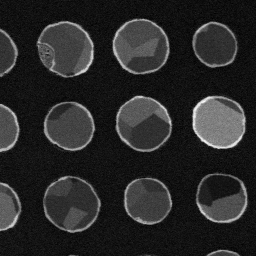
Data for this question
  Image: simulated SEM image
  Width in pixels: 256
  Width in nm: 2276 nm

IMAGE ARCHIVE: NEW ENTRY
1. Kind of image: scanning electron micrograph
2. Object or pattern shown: a regular array of raised bodies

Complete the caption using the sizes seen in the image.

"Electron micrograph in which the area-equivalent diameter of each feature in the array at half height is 0.456 microns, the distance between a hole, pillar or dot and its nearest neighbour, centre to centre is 0.656 micrometres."